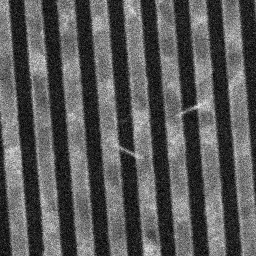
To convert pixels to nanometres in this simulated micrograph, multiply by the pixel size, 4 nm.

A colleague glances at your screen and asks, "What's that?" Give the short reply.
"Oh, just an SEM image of parallel lines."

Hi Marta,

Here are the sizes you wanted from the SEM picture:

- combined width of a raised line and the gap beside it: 32.8 pixels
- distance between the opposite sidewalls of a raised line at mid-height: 61.3 nanometres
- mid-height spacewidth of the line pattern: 68.3 nanometers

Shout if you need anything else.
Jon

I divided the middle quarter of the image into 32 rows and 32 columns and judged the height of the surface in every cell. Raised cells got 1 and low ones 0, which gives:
11110000111100001111000011110000
11110000111100001111000001110000
11110000111100001111000001110000
11110000111100000111000001111000
11110000111100000111100001111000
11110000111100000111100001111000
11110000111100000111100001111000
11110000011100000111100001111000
11110000011110000111100001111000
11110000011110000111100001111000
01111000011110000111100001111000
01111000011110000111100000111000
01111000011110000111100000111000
01111000011110000111100000111000
01111000011110000111100000111000
01111000011110000011100000111000
01111000011110000011100000111100
01111000011110000011100000111100
01111000011110000011110000111100
01111000001110000011100000111100
00111000001111000011110000111100
01111000001111000011110000111100
01111000001111000011110000111100
00111000001111000011110000111100
00111000001111000011110000011100
00111100001111000011110000011100
00111100001111000011110000011100
00111100001111000011110000011100
00111100001111000001110000011110
00111100001111000001111000011110
00111100001111000001111000011110
00111100001111000001111000011110